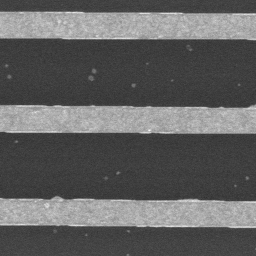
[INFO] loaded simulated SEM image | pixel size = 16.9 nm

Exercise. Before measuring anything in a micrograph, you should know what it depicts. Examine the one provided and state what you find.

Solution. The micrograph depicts lines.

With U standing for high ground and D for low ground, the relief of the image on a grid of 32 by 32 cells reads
DDDDDDDDDDDDDDDDDDDDDDDDDDDDDDDD
DDDDDDDDDDDDDDDDDDDDDDDDDDDDDDDD
UUUUUUUUUUUUUUUUUUUUUUUUUUUUUUUU
UUUUUUUUUUUUUUUUUUUUUUUUUUUUUUUU
UUUUUUUUUUUUUUUUUUUUUUUUUUUUUUUU
DDDDDDDDDDDDDDDDDDDDDDDDDDDDDDDD
DDDDDDDDDDDDDDDDDDDDDDDDDDDDDDDD
DDDDDDDDDDDDDDDDDDDDDDDDDDDDDDDD
DDDDDDDDDDDDDDDDDDDDDDDDDDDDDDDD
DDDDDDDDDDDDDDDDDDDDDDDDDDDDDDDD
DDDDDDDDDDDDDDDDDDDDDDDDDDDDDDDD
DDDDDDDDDDDDDDDDDDDDDDDDDDDDDDDD
DDDDDDDDDDDDDDDDDDDDDDDDDDDDDDDD
UUUUUUUUUUUUUUUUUUUUUUUUUUDUDDDD
UUUUUUUUUUUUUUUUUUUUUUUUUUUUUUUU
UUUUUUUUUUUUUUUUUUUUUUUUUUUUUUUU
DDDDDDDDDDDDDDDDDUUDUUUUUUUUUUUU
DDDDDDDDDDDDDDDDDDDDDDDDDDDDDDDD
DDDDDDDDDDDDDDDDDDDDDDDDDDDDDDDD
DDDDDDDDDDDDDDDDDDDDDDDDDDDDDDDD
DDDDDDDDDDDDDDDDDDDDDDDDDDDDDDDD
DDDDDDDDDDDDDDDDDDDDDDDDDDDDDDDD
DDDDDDDDDDDDDDDDDDDDDDDDDDDDDDDD
DDDDDDDDDDDDDDDDDDDDDDDDDDDDDDDD
DDDDDDDDDDDDDDDDDDDDDDDDDDDDDDDD
UUUUUUUUUUUUUUUUUUUUUUUUUUUUUUUU
UUUUUUUUUUUUUUUUUUUUUUUUUUUUUUUU
UUUUUUUUUUUUUUUUUUUUUUUUUUUUUUUU
DDDDDDDDDDDDDDDDDDDDDDDDDDDDDDDD
DDDDDDDDDDDDDDDDDDDDDDDDDDDDDDDD
DDDDDDDDDDDDDDDDDDDDDDDDDDDDDDDD
DDDDDDDDDDDDDDDDDDDDDDDDDDDDDDDD